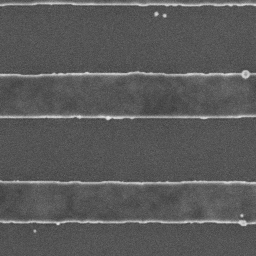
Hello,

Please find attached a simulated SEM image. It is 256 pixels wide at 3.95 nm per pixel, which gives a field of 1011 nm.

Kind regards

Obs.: lines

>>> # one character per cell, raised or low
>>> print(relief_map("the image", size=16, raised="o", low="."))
................
................
................
................
........o......o
oooooooooooooooo
oooooooooooooooo
................
................
................
................
oooooooooooooooo
oooooooooooooooo
oooooooooooooooo
................
................